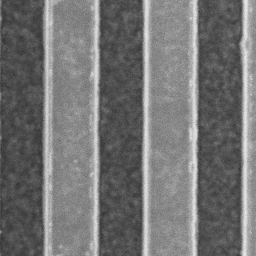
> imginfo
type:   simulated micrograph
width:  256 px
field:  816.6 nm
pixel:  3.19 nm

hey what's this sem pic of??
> one or a few lines or trenches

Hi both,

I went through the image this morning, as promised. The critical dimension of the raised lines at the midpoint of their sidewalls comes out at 0.157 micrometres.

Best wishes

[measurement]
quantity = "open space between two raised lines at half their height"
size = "160 nanometers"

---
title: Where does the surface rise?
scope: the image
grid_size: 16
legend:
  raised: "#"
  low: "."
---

...###...###...#
...###...###...#
...###...###...#
...###...###...#
...###...###...#
...###...###...#
...###...###...#
...###...###...#
...###...###...#
...###...###...#
...###...###...#
...###...###...#
...###...###...#
...###...###...#
...###...###...#
...###...###...#